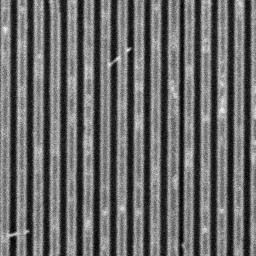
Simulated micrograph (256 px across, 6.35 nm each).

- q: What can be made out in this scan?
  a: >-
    parallel lines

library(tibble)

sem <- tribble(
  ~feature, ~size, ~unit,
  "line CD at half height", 0.0556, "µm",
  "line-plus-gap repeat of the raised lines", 106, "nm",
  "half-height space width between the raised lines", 7.87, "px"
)